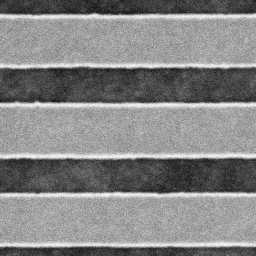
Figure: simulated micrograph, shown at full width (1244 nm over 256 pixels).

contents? one or a few lines or trenches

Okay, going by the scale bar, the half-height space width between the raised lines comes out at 190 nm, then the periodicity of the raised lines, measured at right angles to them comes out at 434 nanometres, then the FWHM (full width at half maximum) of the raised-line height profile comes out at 244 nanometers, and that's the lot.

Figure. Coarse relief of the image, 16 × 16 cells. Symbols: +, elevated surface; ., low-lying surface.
................
++++++++++++++++
++++++++++++++++
++++++++++++++++
................
................
................
++++++++++++++++
++++++++++++++++
++++++++++++++++
................
................
++++++++++++++++
++++++++++++++++
++++++++++++++++
................